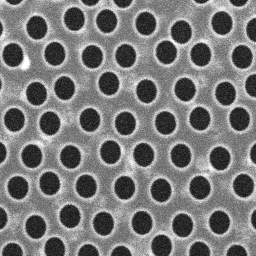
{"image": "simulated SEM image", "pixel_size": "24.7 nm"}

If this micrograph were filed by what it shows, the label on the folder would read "a regular array of holes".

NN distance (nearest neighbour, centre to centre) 823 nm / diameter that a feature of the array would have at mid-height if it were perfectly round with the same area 570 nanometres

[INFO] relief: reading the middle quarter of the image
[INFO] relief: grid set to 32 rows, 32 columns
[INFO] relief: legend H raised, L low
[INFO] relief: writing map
HHHHHLLLLHHHHHLLLHHHHHHHHHHHHHHH
HHHHHHHHHHHHHHHHHHHHHHHHHHHHHHHH
HHHHHHHHHLLLLHHHHHHHHHHHHHHHHHHH
LHHHHHHHHLLLLLHHHHHHHHHHHHHHHLLH
LLHHHHHHLLLLLLHHHHHLLLHHHHHHLLLL
LLLHHHHHLLLLLLHHHHLLLLLHHHHHLLLL
LLLHHHHHHLLLLLHHHHLLLLLHHHHLLLLL
LLLHHHHHHHLLLHHHHHLLLLLHHHHHLLLL
LLHHHHHHHHHHHHHHHHLLLLLHHHHHLLLL
HHHHHHHHHHHHHHHHHHHLLLHHHHHHHHHH
HHHHHHHHHHHHHHHHHHHHHHHHHHHHHHHH
HHHHHLLLHHHHHHHHHHHHHHHHHHHHHHHH
HHHHLLLLLHHHHLLLLHHHHHHLLLLHHHHL
HHHHLLLLLHHHHLLLLLHHHHHLLLLLHHHL
HHHHLLLLLHHHHLLLLLHHHHLLLLLLHHHL
HHHHLLLLLHHHHLLLLLHHHHHLLLLLHHHH
HHHHHLLLHHHHHLLLLLHHHHHLLLLLHHHH
HHHHHHHHHHHHHHLLLHHHHHHHLLLHHHHH
HHHHHHHHHHHHHHHHHHHHHHHHHHHHHHHH
HHHHHHHHHHLLLHHHHHHHHHHHHHHHHHHH
LLLHHHHHHLLLLLHHHHLLLLHHHHHHLLLH
LLLLHHHHHLLLLLHHHLLLLLHHHHHLLLLL
LLLLHHHHHLLLLLHHHLLLLLLHHHHLLLLL
LLLLHHHHHLLLLLHHHLLLLLLHHHHLLLLL
LLLLHHHHHHLLLHHHHHLLLLHHHHHLLLLL
LLLHHHHHHHHHHHHHHHHLLHHHHHHHLLLH
HHHHHHHHHHHHHHHHHHHHHHHHHHHHHHHH
HHHHHHHHHHHHHHHHHHHHHHHHHHHHHHHH
HHHLLLLHHHHHHHLLLHHHHHHHLHHHHHHH
HHHLLLLLHHHHHLLLLLHHHHLLLLHHHHHH
HHHLLLLLHHHHLLLLLLHHHHLLLLLHHHHL
HHHLLLLLHHHHLLLLLLHHHLLLLLLHHHHL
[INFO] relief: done